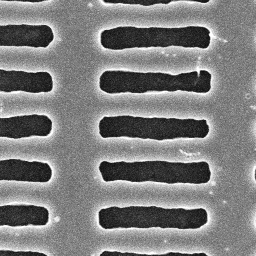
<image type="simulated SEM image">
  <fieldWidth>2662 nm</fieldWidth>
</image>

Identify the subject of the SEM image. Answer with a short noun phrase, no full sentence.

holes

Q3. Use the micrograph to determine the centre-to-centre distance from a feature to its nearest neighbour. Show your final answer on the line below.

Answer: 464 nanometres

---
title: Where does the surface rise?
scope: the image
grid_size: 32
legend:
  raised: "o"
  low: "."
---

oooooooooooooooo.....ooooooooooo
oooooooooooooooooooooooooooooooo
oooooooooooooooooooooooooooooooo
......oooooooo............oooooo
.......oooooo.............oooooo
......ooooooo.............oooooo
oooooooooooooooooooooooooooooooo
oooooooooooooooooooooooooooooooo
oooooooooooooooooooooooooooooooo
......ooooooo.............oooooo
.......ooooo..............oooooo
..o...ooooooo......ooooo..oooooo
oooooooooooooooooooooooooooooooo
oooooooooooooooooooooooooooooooo
oo....oooooooo...ooooooooooooooo
......oooooo..............oooooo
......oooooo..............oooooo
ooooooooooooooooooo..ooooooooooo
oooooooooooooooooooooooooooooooo
oooooooooooooooooooooooooooooooo
......ooooooo.............oooooo
......ooooooo.............oooooo
......ooooooo.............oooooo
oooooooooooooooooooooooooooooooo
oooooooooooooooooooooooooooooooo
oo..oooooooooooooooooooooooooooo
......oooooo..............oooooo
......oooooo..............oooooo
ooooooooooooo...o.ooo....ooooooo
oooooooooooooooooooooooooooooooo
oooooooooooooooooooooooooooooooo
....ooooooooo...oooooooooooooooo